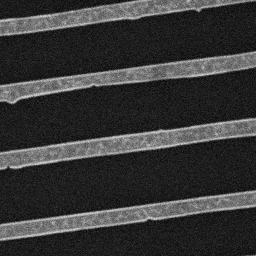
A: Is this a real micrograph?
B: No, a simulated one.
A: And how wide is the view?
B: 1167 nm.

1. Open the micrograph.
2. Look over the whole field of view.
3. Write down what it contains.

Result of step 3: one or a few lines or trenches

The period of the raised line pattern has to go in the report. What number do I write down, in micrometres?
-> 0.31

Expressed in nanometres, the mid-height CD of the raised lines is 67.3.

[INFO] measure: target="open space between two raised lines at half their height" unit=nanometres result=236